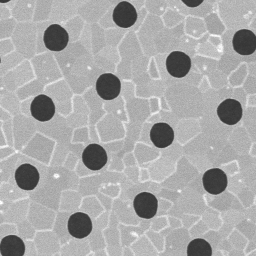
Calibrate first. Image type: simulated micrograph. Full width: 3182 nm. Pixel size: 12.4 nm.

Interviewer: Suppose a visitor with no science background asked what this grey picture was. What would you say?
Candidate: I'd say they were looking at a regular array of holes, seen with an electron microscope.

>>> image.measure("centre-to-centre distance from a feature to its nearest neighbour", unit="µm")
0.87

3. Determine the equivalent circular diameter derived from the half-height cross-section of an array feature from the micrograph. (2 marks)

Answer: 26.1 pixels